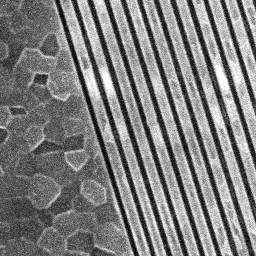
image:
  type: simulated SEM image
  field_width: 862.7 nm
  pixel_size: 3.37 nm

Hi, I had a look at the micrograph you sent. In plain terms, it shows parallel lines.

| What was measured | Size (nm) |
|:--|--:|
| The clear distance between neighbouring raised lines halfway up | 20.5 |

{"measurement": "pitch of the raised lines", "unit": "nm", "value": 53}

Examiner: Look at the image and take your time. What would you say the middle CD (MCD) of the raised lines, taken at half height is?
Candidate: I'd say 9.64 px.